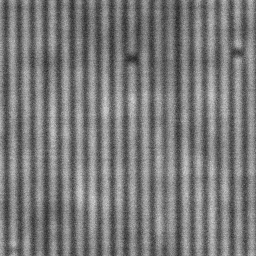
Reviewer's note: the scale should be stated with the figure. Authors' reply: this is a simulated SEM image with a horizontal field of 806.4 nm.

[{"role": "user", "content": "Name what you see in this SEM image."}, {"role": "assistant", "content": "parallel lines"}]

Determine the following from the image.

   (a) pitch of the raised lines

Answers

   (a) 41.7 nm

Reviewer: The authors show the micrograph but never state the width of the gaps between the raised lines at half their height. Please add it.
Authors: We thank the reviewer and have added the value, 18.5 nanometres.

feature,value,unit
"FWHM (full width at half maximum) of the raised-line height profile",0.0248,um